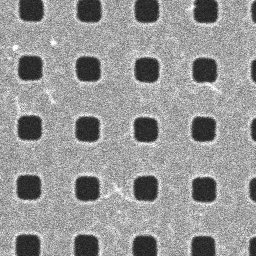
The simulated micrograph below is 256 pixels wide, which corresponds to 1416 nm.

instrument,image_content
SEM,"a regular array of holes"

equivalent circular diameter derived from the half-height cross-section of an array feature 26.6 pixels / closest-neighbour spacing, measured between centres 321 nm